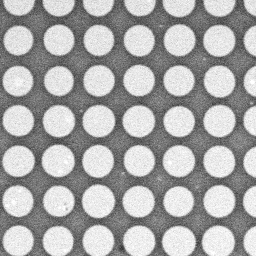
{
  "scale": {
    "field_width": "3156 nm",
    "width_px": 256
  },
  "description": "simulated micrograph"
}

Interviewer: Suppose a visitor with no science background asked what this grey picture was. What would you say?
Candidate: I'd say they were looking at an array of small figures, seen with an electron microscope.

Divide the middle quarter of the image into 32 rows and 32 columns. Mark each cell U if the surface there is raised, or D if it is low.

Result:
DDDDDDDDDDDDDDDDDDUUDDDDDDDDDDDD
UDDDDDUUUUUDDDDDUUUUUUDDDDUUUUUD
UUDDDUUUUUUUDDDUUUUUUUDDDUUUUUUU
UUDDDUUUUUUUDDDUUUUUUUDDDUUUUUUU
UUDDDUUUUUUUDDDUUUUUUUDDDUUUUUUU
UUDDDUUUUUUUDDDUUUUUUUDDDUUUUUUU
UUDDDDUUUUUUDDDDUUUUUUDDDDUUUUUU
DDDDDDDUUUUDDDDDDUUUUDDDDDDUUUDD
DDDDDDDDDDDDDDDDDDDDDDDDDDDDDDDD
DDDDDDDDDDDDDDDDDDDDDDDDDDDDDDDD
DDDDDDDDUUDDDDDDDDDDDDDDDDDDDDDD
UDDDDDUUUUUDDDDDUUUUUDDDDDUUUUUD
UUDDDUUUUUUUDDDUUUUUUUDDDUUUUUUU
UUDDDUUUUUUUUDDUUUUUUUUDDUUUUUUU
UUDDDUUUUUUUUDDUUUUUUUUDDUUUUUUU
UUDDDUUUUUUUDDDUUUUUUUDDDUUUUUUU
UUDDDUUUUUUUDDDDUUUUUUDDDDUUUUUU
UDDDDDUUUUUDDDDDUUUUUDDDDDDUUUUD
DDDDDDDDDDDDDDDDDDDDDDDDDDDDDDDD
DDDDDDDDDDDDDDDDDDDDDDDDDDDDDDDD
DDDDDDDDUUDDDDDDDDUUDDDDDDDDUUDD
UDDDDDUUUUUDDDDDUUUUUDDDDDUUUUUD
UUDDDUUUUUUUDDDUUUUUUUDDDUUUUUUU
UUDDDUUUUUUUDDDUUUUUUUUDDUUUUUUU
UUDDDUUUUUUUDDDUUUUUUUUDDUUUUUUU
UUDDDUUUUUUUDDDUUUUUUUDDDUUUUUUU
UUDDDUUUUUUUDDDDUUUUUUDDDUUUUUUU
UDDDDDUUUUUDDDDDDUUUUDDDDDDUUUUD
DDDDDDDDDDDDDDDDDDDDDDDDDDDDDDDD
DDDDDDDDDDDDDDDDDDDDDDDDDDDDDDDD
DDDDDDDUUUDDDDDDDDDDDDDDDDDDDDDD
UDDDDDUUUUUDDDDDUUUUUDDDDDUUUUUD